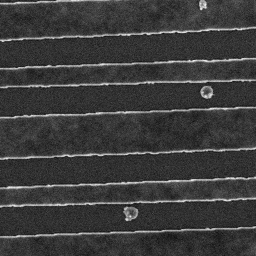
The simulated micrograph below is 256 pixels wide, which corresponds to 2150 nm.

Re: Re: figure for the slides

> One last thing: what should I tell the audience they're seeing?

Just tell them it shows lines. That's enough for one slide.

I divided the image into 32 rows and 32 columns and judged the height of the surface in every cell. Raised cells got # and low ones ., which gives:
################################
################################
################################
################################
############....................
................................
................................
............................####
..##############################
################################
##############..................
.........................#......
................................
.............................###
...#############################
################################
################################
################################
################################
##########......................
................................
................................
........................########
.###############################
################################
############...#................
................#...............
................................
.............................###
..##############################
################################
################################